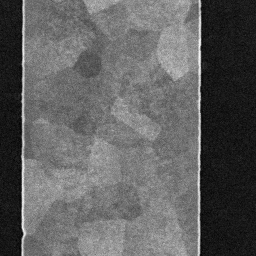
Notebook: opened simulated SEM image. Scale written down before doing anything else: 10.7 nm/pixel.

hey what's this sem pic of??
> one or a few lines or trenches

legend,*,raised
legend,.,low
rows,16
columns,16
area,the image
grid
.***********....
.***********....
.***********....
.***********....
.***********....
.***********....
.***********....
.***********....
.***********....
.***********....
.***********....
.***********....
.***********....
.***********....
.***********....
.***********....